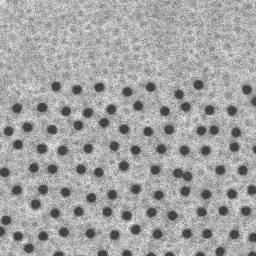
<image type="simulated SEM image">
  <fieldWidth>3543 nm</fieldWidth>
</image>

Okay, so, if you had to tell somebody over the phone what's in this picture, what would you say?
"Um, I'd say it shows a regular array of holes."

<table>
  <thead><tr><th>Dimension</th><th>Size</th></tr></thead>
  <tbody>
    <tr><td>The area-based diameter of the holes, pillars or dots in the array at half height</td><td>134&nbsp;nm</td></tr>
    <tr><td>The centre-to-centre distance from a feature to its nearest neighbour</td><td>272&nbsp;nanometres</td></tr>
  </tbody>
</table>